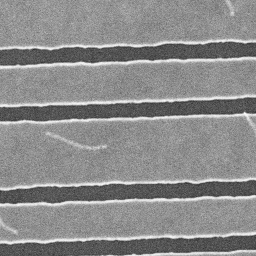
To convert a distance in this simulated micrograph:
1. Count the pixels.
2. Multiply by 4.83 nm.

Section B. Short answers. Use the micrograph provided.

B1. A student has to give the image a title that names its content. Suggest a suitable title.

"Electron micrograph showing lines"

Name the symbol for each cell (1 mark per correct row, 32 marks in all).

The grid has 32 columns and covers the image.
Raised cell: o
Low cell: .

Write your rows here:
oooooooooooooooooooooooooooooooo
oooooooooooooooooooooooooooooooo
oooooooooooooooooooooooooooooooo
oooooooooooooooooooooooooooooooo
oooooooooooooooooooooooooooooooo
oooooooooooooooooooo............
................................
.....................ooooooooooo
oooooooooooooooooooooooooooooooo
oooooooooooooooooooooooooooooooo
oooooooooooooooooooooooooooooooo
oooooooooooooooooooooooooooooooo
oooooooooooooooooooooooo........
................................
........................oooooooo
oooooooooooooooooooooooooooooooo
oooooooooooooooooooooooooooooooo
oooooooooooooooooooooooooooooooo
oooooooooooooooooooooooooooooooo
oooooooooooooooooooooooooooooooo
oooooooooooooooooooooooooooooooo
oooooooooooooooooooooooooooooooo
oooooooooooooooooooooooooooooooo
oo..............................
...............................o
o.oooooooooooooooooooooooooooooo
oooooooooooooooooooooooooooooooo
oooooooooooooooooooooooooooooooo
oooooooooooooooooooooooooooooooo
ooooooooooooooooooooooooooo.....
................................
.............................ooo